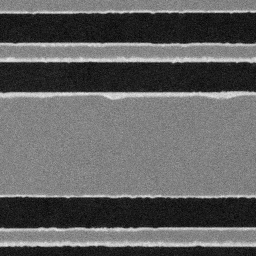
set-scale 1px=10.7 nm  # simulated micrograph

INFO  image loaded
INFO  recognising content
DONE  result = lines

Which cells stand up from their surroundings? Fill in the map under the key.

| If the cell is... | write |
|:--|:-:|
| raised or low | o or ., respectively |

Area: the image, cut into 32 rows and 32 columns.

oooooooooooooooooooooooooooooooo
oooooooooooooo.o...o............
................................
................................
................................
oooooooooooooooooo......oooo....
oooooooooooooooooooooooooooooooo
oooooooooooooooooooooooooooooooo
................................
................................
................................
................................
oooooooooooooooooooooooooooooooo
oooooooooooooooooooooooooooooooo
oooooooooooooooooooooooooooooooo
oooooooooooooooooooooooooooooooo
oooooooooooooooooooooooooooooooo
oooooooooooooooooooooooooooooooo
oooooooooooooooooooooooooooooooo
oooooooooooooooooooooooooooooooo
oooooooooooooooooooooooooooooooo
oooooooooooooooooooooooooooooooo
oooooooooooooooooooooooooooooooo
oooooooooooooooooooooooooooooooo
oooooooooooooooooooooooooooooooo
................................
................................
................................
................................
oooooooooooooooooooooooooooooooo
oooooooooooooooooooooooooooooooo
................................